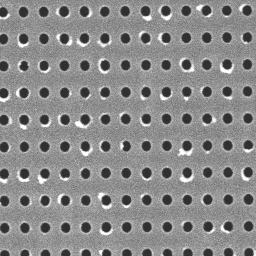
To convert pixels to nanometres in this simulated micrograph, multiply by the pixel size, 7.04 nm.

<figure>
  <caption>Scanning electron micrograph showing a regular array of holes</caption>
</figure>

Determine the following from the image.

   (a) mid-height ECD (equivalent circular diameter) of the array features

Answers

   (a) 71.4 nm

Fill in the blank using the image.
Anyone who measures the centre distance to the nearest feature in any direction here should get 0.142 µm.